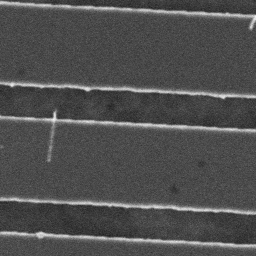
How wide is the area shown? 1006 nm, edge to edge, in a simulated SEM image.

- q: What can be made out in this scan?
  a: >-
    lines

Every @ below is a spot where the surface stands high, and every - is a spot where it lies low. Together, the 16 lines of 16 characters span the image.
@@@@@@@---------
@@@@@@@@@@@@@@@@
@@@@@@@@@@@@@@@@
@@@@@@@@@@@@@@@@
@@@@@@@@@@@@@@@@
-----@@@@@@@@@@@
----------------
@@@@@-----------
@@@@@@@@@@@@@@@@
@@@@@@@@@@@@@@@@
@@@@@@@@@@@@@@@@
@@@@@@@@@@@@@@@@
@@@@@@@@@@@@@@@@
----------------
----------------
@@@@@@@@@@@@@@@@